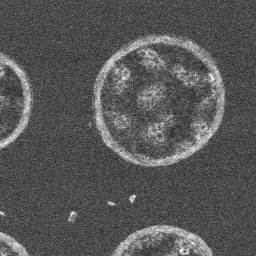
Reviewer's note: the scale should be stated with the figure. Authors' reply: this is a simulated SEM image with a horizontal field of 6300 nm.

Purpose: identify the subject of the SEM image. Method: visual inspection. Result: raised bodies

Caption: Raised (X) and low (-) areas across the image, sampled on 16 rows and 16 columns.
----------------
----------------
----------X-----
-------XXXXXX---
X------XXXXXX---
XX----XXXXXXXX--
XX----XXXXXXXX--
X-----XXXXXXXX--
X------XXXXXX---
--------XXXX----
----------------
----------------
----------------
----------------
---------XX-----
X-------XXXXX---